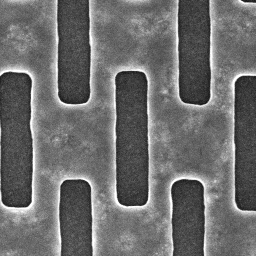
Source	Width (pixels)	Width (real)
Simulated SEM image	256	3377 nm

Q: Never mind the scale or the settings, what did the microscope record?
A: holes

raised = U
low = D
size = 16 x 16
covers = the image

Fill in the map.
UUUUDDUUUUUDDUUU
UUUUDDUUUUUDDUUU
UUUUDDUUUUUDDUUU
UUUUDDUUUUUDDUUU
DUUUDDUUDUUDDUUU
DDUUDDUDDUUDDUUD
DDUUUUUDDUUUDUUD
DDUUUUUDDUUUUUUD
DDUUUUUDDUUUUUUD
DDUUUUUDDUUUUUUD
DDUUUUUDDUUUUUUD
DDUUDUUDDUUDDUUD
DDUUDDUDDUUDDUUD
UUUUDDUUUUUDDUUU
UUUUDDUUUUUDDUUU
UUUUDDUUUUUDDUUU